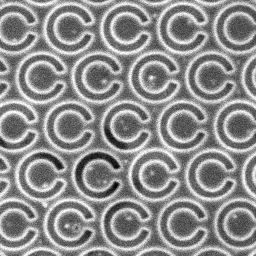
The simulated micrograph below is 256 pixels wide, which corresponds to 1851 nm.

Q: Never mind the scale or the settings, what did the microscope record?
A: an array of small figures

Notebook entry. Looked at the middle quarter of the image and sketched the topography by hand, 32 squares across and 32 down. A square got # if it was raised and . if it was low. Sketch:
###...#####...####..#####...####
###..#######..###..#######..###.
##...############..############.
##...###########...############.
###..############..#######.####.
###..#######..###...######..###.
###...#####...####..#####...####
####.........######........#####
#####.......########......######
###############.#############.##
.....########......########.....
......######........#####.......
####...####..#####...####..#####
#####..###..#######..###...#####
##########..############..######
##########..############..######
##########..############..######
#####..###..#######..###...#####
####...###...#####...####..#####
......#####.........#####....##.
.....#######.......#######......
...###########...###########...#
######.....########.......######
####.........######........#####
####...####...####...###....####
###...######..###...######..###.
###..############..#######..###.
##...############..############.
##...############..############.
###..#######..###..#######..###.
###...######..###...######..####
####...###...#####....##...#####